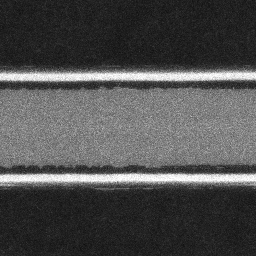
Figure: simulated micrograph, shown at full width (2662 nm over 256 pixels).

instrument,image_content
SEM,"one or a few lines or trenches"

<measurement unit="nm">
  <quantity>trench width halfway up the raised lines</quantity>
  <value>1050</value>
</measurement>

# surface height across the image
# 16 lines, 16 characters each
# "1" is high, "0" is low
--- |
1111111111111111
1111111111111111
1111111111111111
1111111111111111
1111111111111111
0000000000000000
0000000000000000
0000000000000000
0000000000000000
0000000000000000
0000000000000000
1111111111111111
1111111111111111
1111111111111111
1111111111111111
1111111111111111